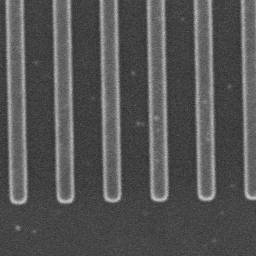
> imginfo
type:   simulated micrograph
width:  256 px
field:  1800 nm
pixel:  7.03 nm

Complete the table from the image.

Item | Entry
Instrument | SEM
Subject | groups of lines, slits or small figures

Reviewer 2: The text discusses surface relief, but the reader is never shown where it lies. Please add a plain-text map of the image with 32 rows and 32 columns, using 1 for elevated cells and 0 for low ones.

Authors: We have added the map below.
01100001100001100011000011000011
01100001100001100011000011000011
01100001100001100001000011000011
01100001100001100001000011000011
01100001100001100001100011000011
01100001100001100001100011000011
01100001100001100001100011000011
01100001100001100001100011000011
01100001100001100001100001000011
01100001100001100001100001100011
01100001100001100001100001100011
01100001100001100001100001100011
01100001100001100001100001100001
01100001100001100001100001100001
01100001100001100001100001100001
01100001100001100001100001100001
01100001100001100001100001100001
01100001100001100001100001100001
01100001100001100001100001100001
01100001100001100001100001100001
01100001100001100001100001100001
01100001100001100001100001100001
01100001100001100001100001100001
01100001100001100001100001100001
01100001100001100001100001100001
00000000000000000000000000000000
00000000000000000000000000000000
00000000000000000000000000000000
00000000000000000000000000000000
00000000000000000000000000000000
00000000000000000000000000000000
00000000000000000000000000000000